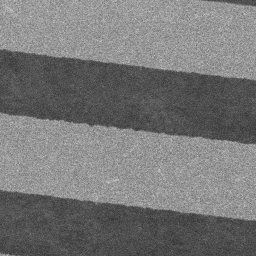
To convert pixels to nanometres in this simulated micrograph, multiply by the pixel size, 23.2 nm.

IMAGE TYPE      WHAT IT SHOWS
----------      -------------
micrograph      one or a few lines or trenches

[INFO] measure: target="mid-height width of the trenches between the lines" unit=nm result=1490